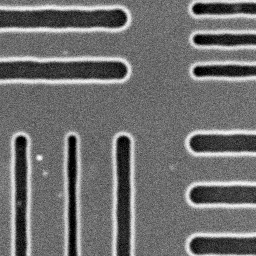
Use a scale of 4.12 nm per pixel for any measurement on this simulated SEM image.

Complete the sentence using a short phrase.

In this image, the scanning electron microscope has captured groups of lines, slits or small figures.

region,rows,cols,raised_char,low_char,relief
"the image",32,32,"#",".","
########################........
................########........
................################
...............#################
########################........
########################........
################################
##..######...###################
................########........
................########........
################################
################################
################################
################################
################################
################################
################################
##.#####..####..########........
##.#####..####...#######........
##.#####..####...###############
##..####..####..################
##..####..####...###############
##..####..####..################
##..####..####...#######........
##..####..####...#######........
##..####..####...#######........
##.#####..####...###############
##.#####..####...###############
##..####..####...###############
##..####..####...########.#..###
##..####..####...#######........
##..####..####...#######........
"